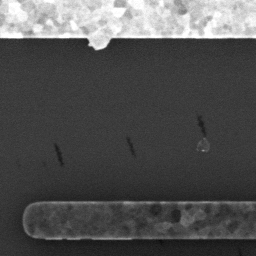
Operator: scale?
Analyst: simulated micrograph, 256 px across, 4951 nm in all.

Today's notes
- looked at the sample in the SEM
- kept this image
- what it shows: wiring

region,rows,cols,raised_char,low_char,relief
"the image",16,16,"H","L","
HHHHHHHHHHHHHHHH
HHHHHHHHHHHHHHHH
LLLLLHHLLLLLLLLL
LLLLLLLLLLLLLLLL
LLLLLLLLLLLLLLLL
LLLLLLLLLLLLLLLL
LLLLLLLLLLLLLLLL
LLLLLLLLLLLLLLLL
LLLLLLLLLLLLLLLL
LLLLLLLLLLLLLLLL
LLLLLLLLLLLLLLLL
LLLLLLLLLLLLLLLL
LLLLLLLLLLLLLLLL
LHHHHHHHHHHHHHHH
LLHHHHHHHHHHHHHH
LLLLLLLLLLLLLLLL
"